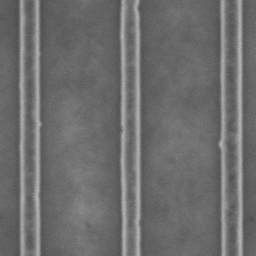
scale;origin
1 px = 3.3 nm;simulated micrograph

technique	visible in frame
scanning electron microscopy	one or a few lines or trenches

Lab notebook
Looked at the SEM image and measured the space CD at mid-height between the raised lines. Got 84.2 px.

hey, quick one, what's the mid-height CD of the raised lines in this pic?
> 17 pixels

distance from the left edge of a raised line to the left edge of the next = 333 nanometers